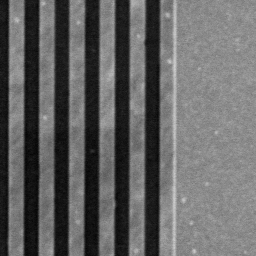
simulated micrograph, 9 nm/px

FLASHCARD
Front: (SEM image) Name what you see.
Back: parallel lines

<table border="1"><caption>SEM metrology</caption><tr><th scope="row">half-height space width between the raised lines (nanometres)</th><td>133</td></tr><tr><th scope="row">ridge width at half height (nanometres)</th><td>140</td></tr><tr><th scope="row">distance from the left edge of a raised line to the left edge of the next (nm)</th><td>272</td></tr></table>